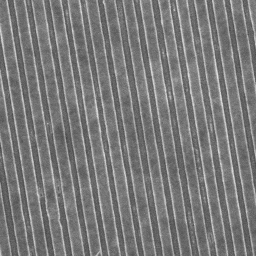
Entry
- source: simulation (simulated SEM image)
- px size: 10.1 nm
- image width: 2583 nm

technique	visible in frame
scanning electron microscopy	parallel lines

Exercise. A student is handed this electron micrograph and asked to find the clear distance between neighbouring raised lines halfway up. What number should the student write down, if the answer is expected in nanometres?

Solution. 59.8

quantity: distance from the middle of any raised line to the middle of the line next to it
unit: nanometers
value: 180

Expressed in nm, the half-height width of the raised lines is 118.